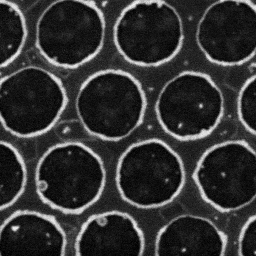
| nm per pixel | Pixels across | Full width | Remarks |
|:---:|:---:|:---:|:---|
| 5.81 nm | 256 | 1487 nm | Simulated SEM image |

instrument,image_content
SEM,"holes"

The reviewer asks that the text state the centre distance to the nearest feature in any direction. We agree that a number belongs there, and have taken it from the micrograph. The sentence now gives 79.5 pixels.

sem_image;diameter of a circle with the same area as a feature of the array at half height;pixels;63.2